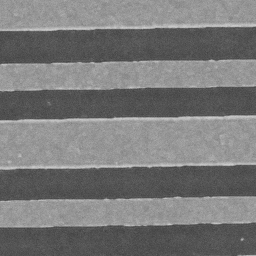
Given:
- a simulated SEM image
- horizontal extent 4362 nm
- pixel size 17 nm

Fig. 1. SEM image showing lines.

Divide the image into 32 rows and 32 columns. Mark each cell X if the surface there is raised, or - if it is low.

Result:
XXXXXXXXXXXXXXXXXXXXXXXXXXXXXXXX
XXXXXXXXXXXXXXXXXXXXXXXXXXXXXXXX
XXXXXXXXXXXXXXXXXXXXXXXXXXXXXXXX
XXXXXXXXXXXXXXXXXX--------------
--------------------------------
--------------------------------
--------------------------------
--------------------------------
XXXXXXXXXXXXXXXXXXXXXXXXXXXXXXXX
XXXXXXXXXXXXXXXXXXXXXXXXXXXXXXXX
XXXXXXXXXXXXXXXXXXXXXXXXXXXXXXXX
--------------------------------
--------------------------------
--------------------------------
--------------------------------
XXXXXXXXXXXXXXXXXXXXXXXXXXXXXXXX
XXXXXXXXXXXXXXXXXXXXXXXXXXXXXXXX
XXXXXXXXXXXXXXXXXXXXXXXXXXXXXXXX
XXXXXXXXXXXXXXXXXXXXXXXXXXXXXXXX
XXXXXXXXXXXXXXXXXXXXXXXXXXXXXXXX
XXXXXXXXXXXXXXXXXXXXXXXXXXXXXXXX
--------------------------------
--------------------------------
--------------------------------
--------------------------------
XXXXXXXXXXXXXXXXXXXXXXXXXXXXXXXX
XXXXXXXXXXXXXXXXXXXXXXXXXXXXXXXX
XXXXXXXXXXXXXXXXXXXXXXXXXXXXXXXX
--------------------------------
--------------------------------
--------------------------------
--------------------------------